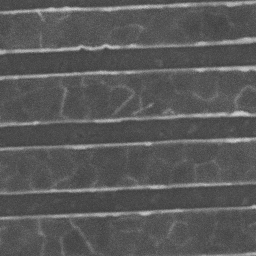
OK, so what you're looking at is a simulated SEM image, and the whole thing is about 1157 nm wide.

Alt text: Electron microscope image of one or a few lines or trenches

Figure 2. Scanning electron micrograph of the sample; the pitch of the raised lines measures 69.6 pixels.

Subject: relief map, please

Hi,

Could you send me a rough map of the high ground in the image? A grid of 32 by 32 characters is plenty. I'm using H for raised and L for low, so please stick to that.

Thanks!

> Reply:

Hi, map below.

LLLLLLLLLLLLLLLLLLLLLLHHHHHHHHHH
HHHHHHHHHHHHHHHHHHHHHHHHHHHHHHHH
HHHHHHHHHHHHHHHHHHHHHHHHHHHHHHHH
HHHHHHHHHHHHHHHHHHHHHHHHHHHHHHHH
HHHHHHHHHHHHHHHHHHHHHHHHHHHHHHHH
HHHHHHHHHHHHHHHHHHHHHHHHHHHLLLLL
HHHLLLLLLLLLLLLLLLLLLLLLLLLLLLLL
LLLLLLLLLLLLLLLLLLLLLLLLLLLLLLLL
LLLLLLLLLLLLLLLLLLLLLLLLLLHHHHHH
LLHHHHHHHHHHHHHHHHHHHHHHHHHHHHHH
HHHHHHHHHHHHHHHHHHHHHHHHHHHHHHHH
HHHHHHHHHHHHHHHHHHHHHHHHHHHHHHHH
HHHHHHHHHHHHHHHHHHHHHHHHHHHHHHHH
HHHHHHHHHHHHHHHHHHHHHHHHHHHHHHHH
HHHHHHHHHHHHHHHHHHHHHHHHHHLLLLHH
HHHHLLLLLLLLLLLLLLLLLLLLLLLLLLLL
LLLLLLLLLLLLLLLLLLLLLLLLLLLLLLLL
LLLLLLLLLLLLLLLLLLLLLLLLLLLHHHHH
LLLHHHHHHHHHHHHHHHHHHHHHHHHHHHHH
HHHHHHHHHHHHHHHHHHHHHHHHHHHHHHHH
HHHHHHHHHHHHHHHHHHHHHHHHHHHHHHHH
HHHHHHHHHHHHHHHHHHHHHHHHHHHHHHHH
HHHHHHHHHHHHHHHHHHHHHHHHHHHHHHHH
HHHHHHHHHHHHHHHHHHHHHLLLLLLLLLLL
LLLLLLLLLLLLLLLLLLLLLLLLLLLLLLLL
LLLLLLLLLLLLLLLLLLLLLLLLLLLLLLLL
LLLLLLLLLLLLLLLLLHHHHHHHHHHHHHHH
HHHHHHHHHHHHHHHHHHHHHHHHHHHHHHHH
HHHHHHHHHHHHHHHHHHHHHHHHHHHHHHHH
HHHHHHHHHHHHHHHHHHHHHHHHHHHHHHHH
HHHHHHHHHHHHHHHHHHHHHHHHHHHHHHHH
HHHHHHHHHHHHHHHHHHHHHHHHHHHHHHHH